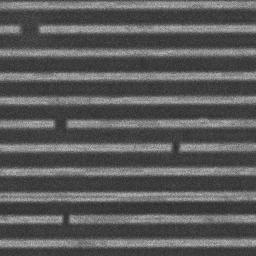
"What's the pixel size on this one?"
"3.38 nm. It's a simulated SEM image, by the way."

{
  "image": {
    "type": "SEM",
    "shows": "parallel lines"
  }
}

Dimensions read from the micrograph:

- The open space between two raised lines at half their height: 47.4 nm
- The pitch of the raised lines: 80.4 nm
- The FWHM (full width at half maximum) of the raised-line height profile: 31.3 nanometers